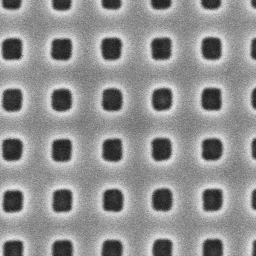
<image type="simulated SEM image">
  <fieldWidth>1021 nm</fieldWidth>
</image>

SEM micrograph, a regular array of holes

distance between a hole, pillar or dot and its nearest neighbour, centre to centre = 197 nm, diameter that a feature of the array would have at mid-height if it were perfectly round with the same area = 98.5 nanometers